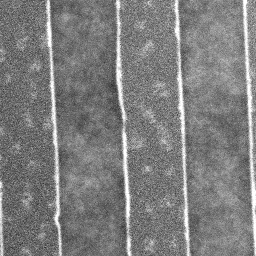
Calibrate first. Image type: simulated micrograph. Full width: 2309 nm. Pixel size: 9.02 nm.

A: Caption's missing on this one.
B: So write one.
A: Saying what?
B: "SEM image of one or a few lines or trenches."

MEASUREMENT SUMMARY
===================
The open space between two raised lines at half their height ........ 601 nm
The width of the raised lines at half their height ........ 537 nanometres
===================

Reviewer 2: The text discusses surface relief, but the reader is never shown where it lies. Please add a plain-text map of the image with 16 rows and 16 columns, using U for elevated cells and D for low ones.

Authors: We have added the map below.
UUUDDDDUUUUDDDDU
UUUDDDDUUUUDDDDU
UUUDDDDUUUUDDDDU
UUUDDDDUUUUDDDDU
UUUDDDDUUUUDDDDU
UUUDDDDUUUUDDDDU
UUUDDDDDUUUDDDDD
UUUDDDDDUUUDDDDD
UUUDDDDDUUUDDDDD
UUUUDDDDUUUUDDDD
UUUUDDDDUUUUDDDD
UUUUDDDDUUUUDDDD
UUUUDDDDUUUUDDDD
UUUUDDDDUUUUDDDD
UUUUDDDDUUUUDDDD
UUUUDDDDUUUUDDDD